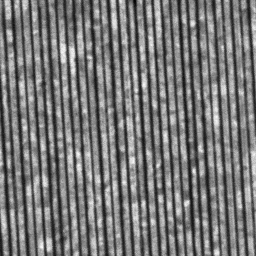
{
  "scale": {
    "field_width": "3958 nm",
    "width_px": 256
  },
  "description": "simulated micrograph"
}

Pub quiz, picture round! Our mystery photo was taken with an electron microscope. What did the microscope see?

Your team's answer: parallel lines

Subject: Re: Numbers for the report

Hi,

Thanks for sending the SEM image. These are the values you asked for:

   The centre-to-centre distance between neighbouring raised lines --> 135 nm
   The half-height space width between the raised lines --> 57.8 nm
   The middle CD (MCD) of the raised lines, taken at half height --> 4.61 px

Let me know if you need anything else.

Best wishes